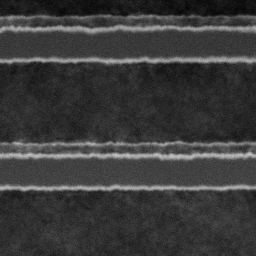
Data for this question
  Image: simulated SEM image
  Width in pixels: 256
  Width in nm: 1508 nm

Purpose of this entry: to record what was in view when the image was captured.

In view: lines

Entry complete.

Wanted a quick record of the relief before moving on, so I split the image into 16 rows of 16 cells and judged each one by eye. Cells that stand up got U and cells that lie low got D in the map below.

DDDDDDDDDDDDDDDD
UUUUUUUUUUUUUUUU
UUUUUUUUUUUUUUUU
UUUUUUUUUUUUUUUU
DDDDDDDDDDDDDDDD
DDDDDDDDDDDDDDDD
DDDDDDDDDDDDDDDD
DDDDDDDDDDDDDDDD
DDDDDDDDDDDDDDDD
UUUUUUUUUUUUUUUU
UUUUUUUUUUUUUUUU
UUUUUUUUUUUUUUUU
DDDDDDDDDDDDDDDD
DDDDDDDDDDDDDDDD
DDDDDDDDDDDDDDDD
DDDDDDDDDDDDDDDD